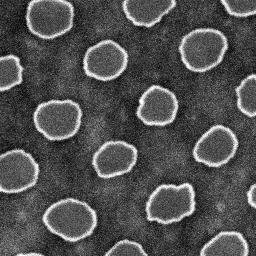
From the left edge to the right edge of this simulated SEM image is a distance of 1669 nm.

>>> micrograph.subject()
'a regular array of raised bodies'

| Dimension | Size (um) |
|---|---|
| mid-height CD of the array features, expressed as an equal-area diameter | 0.27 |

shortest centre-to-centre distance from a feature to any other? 458 nanometres